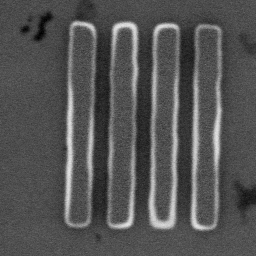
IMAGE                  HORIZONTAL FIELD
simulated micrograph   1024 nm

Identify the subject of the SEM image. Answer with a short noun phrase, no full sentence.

groups of lines, slits or small figures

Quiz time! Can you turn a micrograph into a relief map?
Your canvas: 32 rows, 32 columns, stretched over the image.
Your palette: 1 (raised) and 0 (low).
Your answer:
00000000000000000000000000000000
00000000000000000000000000000000
00000000000000000000000000000000
00000000011000011000110001100000
00000000011100111001110001100000
00000000011100111001110001100000
00000000011100111001110001100000
00000000011100111001110001100000
00000000011100111001110011100000
00000000011100111001110011100000
00000000011100111001110011100000
00000000011100111001110001100000
00000000011100111001110001100000
00000000011100111001110011100000
00000000011000111001110011100000
00000000011000111001110011100000
00000000011000111001110011100000
00000000011000111001110011100000
00000000011000111001110011100000
00000000011000111001110011100000
00000000011000111001110011100000
00000000011000111001110011100000
00000000011000111001110011100000
00000000011000111001110011100000
00000000011000111001110011100000
00000000111000110001110011100000
00000000111000110001110011100000
00000000111000110001100011100000
00000000000000000000000001000000
00000000000000000000000000000000
00000000000000000000000000000000
00000000000000000000000000000000